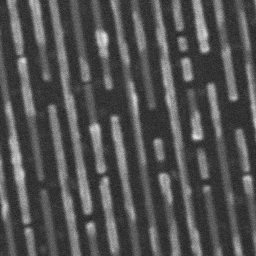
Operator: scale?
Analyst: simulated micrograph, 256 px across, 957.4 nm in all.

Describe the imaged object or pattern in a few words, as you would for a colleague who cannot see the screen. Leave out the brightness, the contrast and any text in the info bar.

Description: parallel lines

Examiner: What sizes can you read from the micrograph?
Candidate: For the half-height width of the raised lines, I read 22.2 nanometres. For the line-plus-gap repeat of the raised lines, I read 0.076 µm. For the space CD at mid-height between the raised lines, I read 54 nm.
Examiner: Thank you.